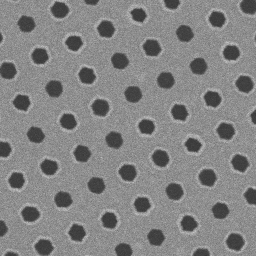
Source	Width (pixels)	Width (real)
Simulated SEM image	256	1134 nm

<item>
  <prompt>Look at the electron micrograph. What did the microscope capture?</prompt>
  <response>a regular array of holes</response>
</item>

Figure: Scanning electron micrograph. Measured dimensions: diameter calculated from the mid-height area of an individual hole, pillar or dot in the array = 70.8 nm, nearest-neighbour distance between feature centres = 154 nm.